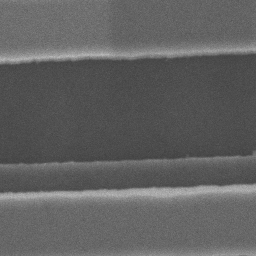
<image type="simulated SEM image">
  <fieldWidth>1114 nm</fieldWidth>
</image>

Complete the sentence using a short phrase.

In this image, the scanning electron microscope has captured lines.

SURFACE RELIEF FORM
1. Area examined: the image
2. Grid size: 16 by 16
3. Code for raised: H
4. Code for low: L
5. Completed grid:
HHHHHHHHHHHHHHHH
HHHHHHHHHHHHHHHH
HHHHHHHHHHHHHHHH
HHHHHLLHLLLLLLLL
LLLLLLLLLLLLLLLL
LLLLLLLLLLLLLLLL
LLLLLLLLLLLLLLLL
LLLLLLLLLLLLLLLL
LLLLLLLLLLLLLLLL
LLLLLLLLLLLLLLLL
HHHHHHHHHHHHHHHH
HHHHHHHHHHHHHHHH
HHHHHHHHHHHHHHHH
HHHHHHHHHHHHHHHH
HHHHHHHHHHHHHHHH
HHHHHHHHHHHHHHHH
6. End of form